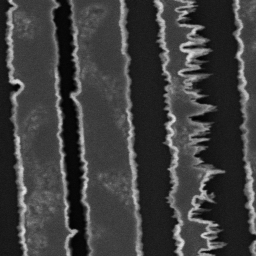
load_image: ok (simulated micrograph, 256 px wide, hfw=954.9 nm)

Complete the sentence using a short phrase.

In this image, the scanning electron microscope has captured one or a few lines or trenches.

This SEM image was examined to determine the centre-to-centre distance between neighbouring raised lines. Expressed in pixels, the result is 73.1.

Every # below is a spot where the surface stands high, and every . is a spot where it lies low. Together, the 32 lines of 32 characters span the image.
.######..#######...#####.....###
.######..#######....####.....###
.######..#######....###......###
.######..#######....#####.....##
.######..#######....#####....###
.######..#######....#####.....##
.######..#######....######....##
.######..#######....#####.....##
.######..#######....#####.....##
.######..#######.....####.....##
..#####..#######.....###......##
..######.#######.....###......##
.#######.#######.....####.....##
..######.#######.....#####....##
..######..######.....###......##
..######..######.....#####....##
..######..#######....#####....##
..######..#######....####.....##
..######..#######....####......#
..######..#######.....###......#
..######..#######....####......#
..######..#######....######....#
..######..#######....#####.....#
..######..#######.....####.....#
..######..#######....#####.....#
..#######.#######....####......#
...######..######.....###......#
...######..#######....####.....#
..#######..#######....#####....#
..#######..#######....#####.....
...######..#######....#####.....
...######..#######....####.....#